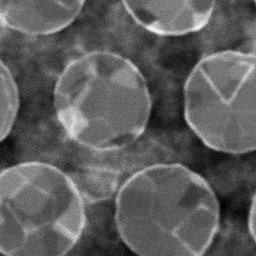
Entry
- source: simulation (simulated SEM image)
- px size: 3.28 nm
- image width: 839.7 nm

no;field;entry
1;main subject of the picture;raised bodies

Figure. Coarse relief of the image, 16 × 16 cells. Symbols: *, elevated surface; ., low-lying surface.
*****...*****...
.***.....****...
................
.....**......***
*...*****...****
*...*****...****
*..******...****
*...*****...****
.....****...****
................
.**......***....
*****...*****...
*****..*******..
*****..*******..
*****..******...
****....*****...